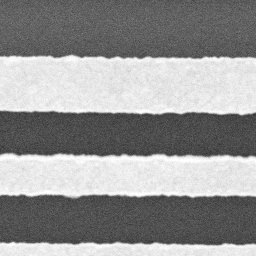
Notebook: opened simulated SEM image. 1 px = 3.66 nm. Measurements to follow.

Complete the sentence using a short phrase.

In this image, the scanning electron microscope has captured lines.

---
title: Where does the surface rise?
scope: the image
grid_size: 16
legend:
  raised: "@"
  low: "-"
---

----------------
----------------
----------------
----------------
@@@@@@@@@@@@@@@@
@@@@@@@@@@@@@@@@
@@@@@@@@@@@@@@@@
----------------
----------------
----------------
@@@@@@@@@@@@@@@@
@@@@@@@@@@@@@@@@
----------------
----------------
----------------
@@@@@@@@@@@@@@@@